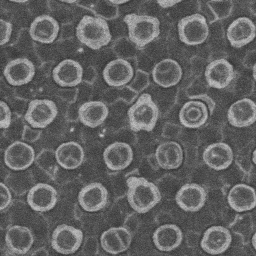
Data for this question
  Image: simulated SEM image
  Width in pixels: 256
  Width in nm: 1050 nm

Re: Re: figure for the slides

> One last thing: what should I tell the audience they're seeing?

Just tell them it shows a regular array of raised bodies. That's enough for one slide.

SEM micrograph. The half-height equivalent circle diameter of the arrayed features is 113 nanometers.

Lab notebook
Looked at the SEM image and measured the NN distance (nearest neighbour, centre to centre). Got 194 nm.